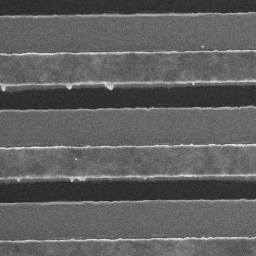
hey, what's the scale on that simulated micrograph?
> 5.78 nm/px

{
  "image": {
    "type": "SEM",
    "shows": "lines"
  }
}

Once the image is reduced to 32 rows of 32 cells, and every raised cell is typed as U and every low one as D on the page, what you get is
DDDDDDDDDDDDDDDDDDDDDDDDDDDDDDDD
DDDDDDDDDDDDDDDDDDDDDDDDDDDDDDDD
UUUUUUUUUUUUUUUUUUUUUUUUUUUUUUUU
UUUUUUUUUUUUUUUUUUUUUUUUUUUUUUUU
UUUUUUUUUUUUUUUUUUUUUUUUUUUUUUUU
UUUUUUUUUUUUUUUUUUUUUUUUUUUUUUUU
UUUUUUUUUUUUUUUUUUUUUUUUUUUUUUUU
UUUUUUUUUUUUUUUUUUUUUUUUUUUUUUUU
UUUUUUUUUUUUUUUUUUUUUUUUUUUUUUUU
UUUUUUUUUUUUUUUUUUUUUUUUUUUUUUUU
UUUUUUUUUUUUUUUUUDUUUUDDDDDDDDDD
DDDDDDDDDDDDDDDDDDDDDDDDDDDDDDDD
DDDDDDDDDDDDDDDDDDDDDDDDDDDDDDDD
DDDDDDDDDDDDDDDDDDDUDDDDUUUUUUUU
UUUUUUUUUUUUUUUUUUUUUUUUUUUUUUUU
UUUUUUUUUUUUUUUUUUUUUUUUUUUUUUUU
UUUUUUUUUUUUUUUUUUUUUUUUUUUUUUUU
UUUUUUUUUUUUUUUUUUUUUUUUUUUUUUUU
UUUUUUUUUUUUUUUUUUUUUUUUUUUUUUUU
UUUUUUUUUUUUUUUUUUUUUUUUUUUUUUUU
UUUUUUUUUUUUUUUUUUUUUUUUUUUUUUUU
UUUUUUUUUUUUUUUUUUUUUUUUUUUUUUUU
DDDDDDDDDDDDDDDDDDDDDDDDDDDDDDDD
DDDDDDDDDDDDDDDDDDDDDDDDDDDDDDDD
DDDDDDDDDDDDDDDDDDDDDDDDDDDDDDDD
UUUUUUUUUUUUUUUUUUUUUUUUUUUUUUUU
UUUUUUUUUUUUUUUUUUUUUUUUUUUUUUUU
UUUUUUUUUUUUUUUUUUUUUUUUUUUUUUUU
UUUUUUUUUUUUUUUUUUUUUUUUUUUUUUUU
UUUUUUUUUUUUUUUUUUUUUUUUUUUUUUUU
UUUUUUUUUUUUUUUUUUUUUUUUUUUUUUUU
UUUUUUUUUUUUUUUUUUUUUUUUUUUUUUUU